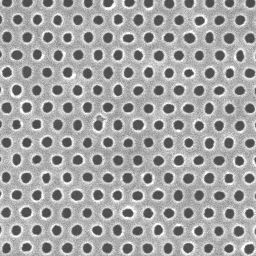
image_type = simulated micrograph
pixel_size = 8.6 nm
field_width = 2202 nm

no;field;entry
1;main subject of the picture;a regular array of holes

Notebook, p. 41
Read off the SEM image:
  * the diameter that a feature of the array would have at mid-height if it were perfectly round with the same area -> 0.089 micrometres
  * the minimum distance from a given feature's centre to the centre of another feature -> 170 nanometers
